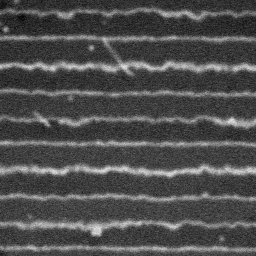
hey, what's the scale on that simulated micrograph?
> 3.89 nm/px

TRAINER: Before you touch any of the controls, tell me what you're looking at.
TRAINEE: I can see lines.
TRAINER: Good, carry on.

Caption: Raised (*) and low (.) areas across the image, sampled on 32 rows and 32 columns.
********************************
**********.******...************
................................
................................
................................
********************************
********************************
********************************
.............**....*....*...**.*
................................
................................
******.****.........**..........
********************************
********************************
********************************
.........*..................****
................................
................................
********************************
********************************
********************************
.......*..........****..........
................................
................................
.**..........***.........*......
********************************
********************************
********************************
..........***...................
................................
................................
********************************